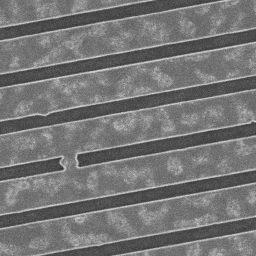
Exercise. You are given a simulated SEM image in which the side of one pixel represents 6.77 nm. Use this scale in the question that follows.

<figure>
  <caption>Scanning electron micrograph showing parallel lines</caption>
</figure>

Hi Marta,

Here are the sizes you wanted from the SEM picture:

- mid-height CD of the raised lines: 221 nanometers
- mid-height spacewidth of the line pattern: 90 nm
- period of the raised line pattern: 46.3 px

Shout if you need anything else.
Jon